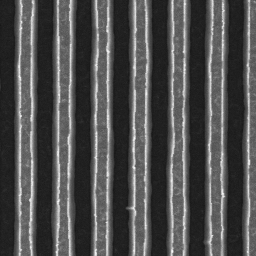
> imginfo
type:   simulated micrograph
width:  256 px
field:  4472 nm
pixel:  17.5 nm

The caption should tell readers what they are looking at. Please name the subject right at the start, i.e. parallel lines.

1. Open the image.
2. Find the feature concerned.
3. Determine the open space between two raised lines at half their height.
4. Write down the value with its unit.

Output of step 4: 358 nm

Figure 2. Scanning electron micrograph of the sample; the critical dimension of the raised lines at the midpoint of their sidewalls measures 297 nm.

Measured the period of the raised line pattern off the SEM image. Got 0.665 microns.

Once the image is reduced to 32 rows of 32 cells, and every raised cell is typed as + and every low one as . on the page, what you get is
..++...++...++..++...++...++...+
..++...++...++..+++..++...++...+
..++...++...++..+++..++...++...+
..++...++...++...++..++...++...+
..++...++...++...++..++...++...+
..++...++...++...++..++...++...+
..++...++...++...++..++...++...+
..++...++...++...++..++...++...+
..++...++...++..+++..++...++...+
..++...++...++..+++..++...++...+
..++...++...++...++..++...++...+
..++...++...++...++..++...++...+
..++...++...++..+++..++...++...+
..++...++...++..+++..++...++...+
..++...++...++..+++..++...++...+
..++...++...++..+++..++...++...+
..++...++...++..+++..++...++...+
..++...++...++..+++..++...++...+
..++...++...++..+++..++...++...+
..++...++...++..+++..++...++...+
..++...++...++..+++..++...++...+
..++...++...++..+++..++...++...+
..++...++...++..+++..++...++...+
..++...++...++..+++..++...++...+
..++...++...++...++..++...++...+
..++...++...++..++...++...++...+
..++...++...++..++...++...++...+
..++...++...++...+...++...++...+
..++...++...++..++...++...++...+
..++...++...++..++...++...++...+
..++...++...++..++...++...++...+
..++...++...++..++...++...++...+